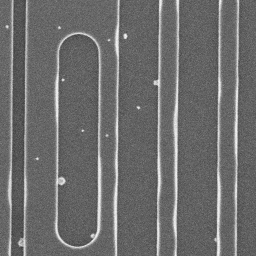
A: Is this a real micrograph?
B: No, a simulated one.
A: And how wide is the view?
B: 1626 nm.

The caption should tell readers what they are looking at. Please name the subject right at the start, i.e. groups of lines, slits or small figures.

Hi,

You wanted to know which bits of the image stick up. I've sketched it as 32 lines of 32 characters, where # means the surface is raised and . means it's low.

##.############.....##.....###..
##.############.....##.....###..
##.############.....##.....###..
##.############.....##.....###..
##.######..####.....##.....###..
##.#####....###.....##.....###..
##.####.....###.....##.....###..
##.####.....###.....##.....###..
##.####.....###.....##.....###..
##.####.....###.....##.....###..
##.####.....###.....##.....###..
#..####.....###.....##.....###..
#..####.....###.....##.....###..
#..####.....###.....##.....###..
#..####.....###.....##.....###..
#..####.....###.....##.....##...
#..####.....###.....##.....##...
#..####.....###.....##.....##...
#..####.....###.....##.....##...
#..####.....###.....##.....###..
#..####.....###.....##.....###..
#..####.....###.....##.....###..
#..####.....###.....##.....###..
#..####.....###.....##.....##...
#..####.....###.....##.....##...
#..####.....##......##.....##...
#..####.....##......##.....##...
#..####.....##......##.....##...
#..####.....###.....##.....##...
#..####.....###.....##.....##...
#..#####...####.....##.....##...
#..############.....##.....##...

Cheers